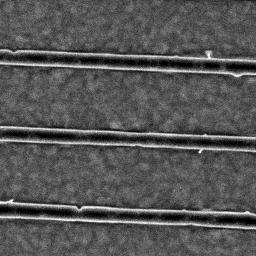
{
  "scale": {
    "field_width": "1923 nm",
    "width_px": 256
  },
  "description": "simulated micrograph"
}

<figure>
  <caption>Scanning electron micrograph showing one or a few lines or trenches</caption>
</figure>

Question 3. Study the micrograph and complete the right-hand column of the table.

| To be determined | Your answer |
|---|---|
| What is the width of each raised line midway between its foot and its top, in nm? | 108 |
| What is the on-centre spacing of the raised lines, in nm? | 576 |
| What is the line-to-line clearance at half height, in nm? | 473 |